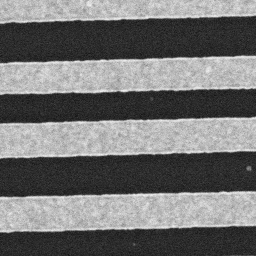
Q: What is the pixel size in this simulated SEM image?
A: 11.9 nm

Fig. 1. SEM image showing lines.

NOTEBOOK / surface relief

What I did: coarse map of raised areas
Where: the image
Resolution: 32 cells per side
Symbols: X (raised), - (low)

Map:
XXXXXXXXXXXXXXXXXXXXXXXXXXXXXXXX
XXXXXXXXXXXXXXXXXXXXXXXXXXXXXXXX
XXXXXXXXXXXX--------------------
--------------------------------
--------------------------------
--------------------------------
--------------------------------
------------------XXXXXXXXXXXXXX
XXXXXXXXXXXXXXXXXXXXXXXXXXXXXXXX
XXXXXXXXXXXXXXXXXXXXXXXXXXXXXXXX
XXXXXXXXXXXXXXXXXXXXXXXXXXXXXXXX
XXXXXXXXXXXXX-------------------
--------------------------------
--------------------------------
--------------------------------
-----XXXXXXXXXXXXXXXXXXXXXXXXXXX
XXXXXXXXXXXXXXXXXXXXXXXXXXXXXXXX
XXXXXXXXXXXXXXXXXXXXXXXXXXXXXXXX
XXXXXXXXXXXXXXXXXXXXXXXXXXXXXXXX
XXXXX---------------------------
--------------------------------
--------------------------------
--------------------------------
--------------------------------
-------------XXXXXXXXXXXXXXXXXXX
XXXXXXXXXXXXXXXXXXXXXXXXXXXXXXXX
XXXXXXXXXXXXXXXXXXXXXXXXXXXXXXXX
XXXXXXXXXXXXXXXXXXXXXXXXXXXXXXXX
XXXXXXXXXXXXXXXXX---------------
--------------------------------
--------------------------------
--------------------------------